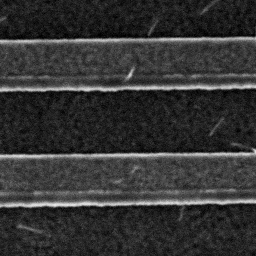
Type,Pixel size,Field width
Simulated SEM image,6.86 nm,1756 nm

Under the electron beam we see lines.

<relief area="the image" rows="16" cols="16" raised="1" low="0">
0000000000000000
0000000000000000
0000011111111111
1111111111111111
1111111111111111
1111111111110100
0000000000000000
0000000000000000
0000000000000000
0000000000000000
1111111111111111
1111111111111111
1111111111111111
0000000000000000
0000000000000000
0000000000000000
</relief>